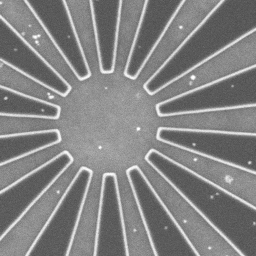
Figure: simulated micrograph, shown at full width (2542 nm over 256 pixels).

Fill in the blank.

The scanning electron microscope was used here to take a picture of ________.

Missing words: groups of lines, slits or small figures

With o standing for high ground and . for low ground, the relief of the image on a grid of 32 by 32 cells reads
...ooooo...oooo...ooooo....ooooo
....ooooo...ooo...oooo....oooooo
.....oooo...ooo...ooo.....oooooo
oo....ooo...ooo..oooo....ooooooo
oo....oooo..ooo..ooo....ooooooo.
oooo...ooo..oo...ooo...oooooo...
oooo....oo..oo..ooo...ooooo.....
ooooo...ooo.oo..oo...ooooo......
..ooooo..oo..o..oo..oooo.......o
...oooo...o.....o..oooo......ooo
.....ooo..........ooo.....oooooo
oo.....o................oooooooo
ooooo................ooooooooooo
ooooooo.............ooooooooo...
...oooo.........................
................................
.....oo.............ooooooo.....
ooooooo.............oooooooooooo
ooooo..................ooooooooo
ooo....oo.........oo......oooooo
......ooo..........ooo.......ooo
....oooo..o.....oo..oooo.......o
..ooooo..oo..o..oo...ooooo......
.ooooo...oo..oo..oo...oooooo....
ooooo...ooo..oo..ooo...oooooo...
oooo...ooo...oo..ooo....ooooooo.
ooo....ooo..ooo...ooo....ooooooo
oo....oooo..ooo...oooo....oooooo
o....oooo...ooo...oooo.....ooooo
.....oooo...oooo...oooo.....oooo
....ooooo...oooo...ooooo.....ooo
....ooooo...oooo...ooooo......oo